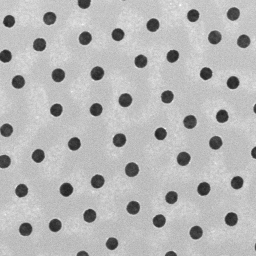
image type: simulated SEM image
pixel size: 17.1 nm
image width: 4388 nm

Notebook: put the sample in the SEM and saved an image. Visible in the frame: a regular array of holes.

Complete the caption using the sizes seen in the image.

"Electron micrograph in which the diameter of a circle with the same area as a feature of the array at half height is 230 nanometers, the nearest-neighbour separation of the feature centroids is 552 nm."